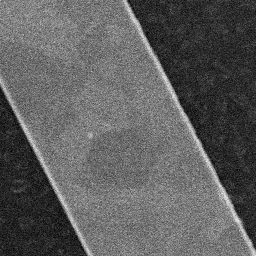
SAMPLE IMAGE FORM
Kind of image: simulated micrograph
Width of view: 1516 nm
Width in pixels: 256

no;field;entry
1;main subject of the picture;one or a few lines or trenches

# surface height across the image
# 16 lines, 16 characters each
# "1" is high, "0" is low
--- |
1111111100000000
1111111110000000
1111111110000000
1111111111000000
1111111111000000
1111111111100000
0111111111100000
0111111111110000
0011111111110000
0011111111111000
0001111111111000
0001111111111100
0000111111111100
0000111111111110
0000011111111110
0000011111111111